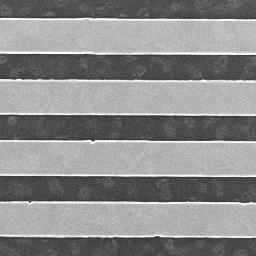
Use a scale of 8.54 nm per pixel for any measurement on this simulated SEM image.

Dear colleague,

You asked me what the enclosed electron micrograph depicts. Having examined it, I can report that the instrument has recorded parallel lines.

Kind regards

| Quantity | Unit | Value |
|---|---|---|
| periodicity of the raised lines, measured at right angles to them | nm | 522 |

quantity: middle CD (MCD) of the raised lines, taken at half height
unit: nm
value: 295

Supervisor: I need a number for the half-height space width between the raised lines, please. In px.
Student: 26.1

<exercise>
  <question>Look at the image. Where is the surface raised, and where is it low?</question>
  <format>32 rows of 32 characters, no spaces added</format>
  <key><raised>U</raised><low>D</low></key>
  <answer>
DDDDDDDDDDDDDDDDDDDDDDDDDDDDDDDD
DDDDDDDDDDDDDDDDDDDDDDDDDDDDDDDD
UUUUUUUUUUUUUUUUUUUUUUUUUUUUUDDD
UUUUUUUUUUUUUUUUUUUUUUUUUUUUUUUU
UUUUUUUUUUUUUUUUUUUUUUUUUUUUUUUU
UUUUUUUUUUUUUUUUUUUUUUUUUUUUUUUU
UUUUUUUUUUUUUUUUUUUUUUUUUUUUUUUU
DDDDDDDDDDDDDDDDDDDDDDDDDDDDDDDD
DDDDDDDDDDDDDDDDDDDDDDDDDDDDDDDD
DDDDDDDDDDDDDDDDDDDDDDDDDDDDDDDD
UUUUUUUUUUUUUUUUUUUUUUUUUUUUUUUU
UUUUUUUUUUUUUUUUUUUUUUUUUUUUUUUU
UUUUUUUUUUUUUUUUUUUUUUUUUUUUUUUU
UUUUUUUUUUUUUUUUUUUUUUUUUUUUUUUU
DDDDDDDDDDDDDDDDDDDDDDDDDDDDDDDD
DDDDDDDDDDDDDDDDDDDDDDDDDDDDDDDD
DDDDDDDDDDDDDDDDDDDDDDDDDDDDDDDD
DDDDDDDDDDDDDDDDDDDDDDDDDDDDDDDD
UUUUUUUUUUUUUUUUUUUUUUUUUUUUUUUU
UUUUUUUUUUUUUUUUUUUUUUUUUUUUUUUU
UUUUUUUUUUUUUUUUUUUUUUUUUUUUUUUU
UUUUUUUUUUUUUUUUUUUUUUUUUUUUUUUU
DDDDDDDDDDDDDDDDDDDDDDDDDDDDDDDD
DDDDDDDDDDDDDDDDDDDDDDDDDDDDDDDD
DDDDDDDDDDDDDDDDDDDDDDDDDDDDDDDD
UUUUUUUUUUUUUUUUUUUUUUUUUUUUUUUU
UUUUUUUUUUUUUUUUUUUUUUUUUUUUUUUU
UUUUUUUUUUUUUUUUUUUUUUUUUUUUUUUU
UUUUUUUUUUUUUUUUUUUUUUUUUUUUUUUU
DDDUUUUUUUUUUUUUUUUUUUUUUUUUUUUU
DDDDDDDDDDDDDDDDDDDDDDDDDDDDDDDD
DDDDDDDDDDDDDDDDDDDDDDDDDDDDDDDD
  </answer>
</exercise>